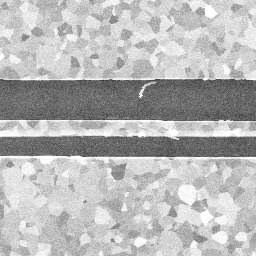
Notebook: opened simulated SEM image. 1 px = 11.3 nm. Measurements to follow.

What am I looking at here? lines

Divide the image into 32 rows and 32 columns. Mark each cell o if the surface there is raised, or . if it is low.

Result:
oooooooooooooooooooooooooooooooo
oooooooooooooooooooooooooooooooo
oooooooooooooooooooooooooooooooo
oooooooooooooooooooooooooooooooo
oooooooooooooooooooooooooooooooo
oooooooooooooooooooooooooooooooo
oooooooooooooooooooooooooooooooo
oooooooooooooooooooooooooooooooo
oooooooooooooooooooooooooooooooo
oooooooooooooooooooooooooooooooo
................................
................................
................................
................................
................................
oooooooooooooooooooooooooooooooo
oooooooooooooooooooooooooooooooo
................................
................................
................................
oooooooooooooooooooooooooooooooo
oooooooooooooooooooooooooooooooo
oooooooooooooooooooooooooooooooo
oooooooooooooooooooooooooooooooo
oooooooooooooooooooooooooooooooo
oooooooooooooooooooooooooooooooo
oooooooooooooooooooooooooooooooo
oooooooooooooooooooooooooooooooo
oooooooooooooooooooooooooooooooo
oooooooooooooooooooooooooooooooo
oooooooooooooooooooooooooooooooo
oooooooooooooooooooooooooooooooo